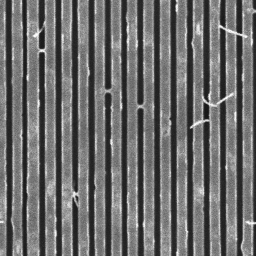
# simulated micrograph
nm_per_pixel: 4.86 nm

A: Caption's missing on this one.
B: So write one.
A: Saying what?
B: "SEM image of parallel lines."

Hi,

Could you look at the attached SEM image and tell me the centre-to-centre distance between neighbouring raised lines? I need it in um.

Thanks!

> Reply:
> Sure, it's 0.08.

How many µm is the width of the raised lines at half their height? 0.0541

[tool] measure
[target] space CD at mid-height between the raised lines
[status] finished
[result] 27.3 nanometers